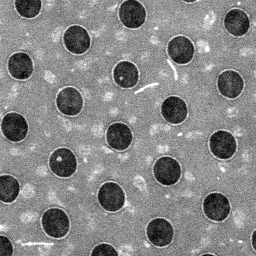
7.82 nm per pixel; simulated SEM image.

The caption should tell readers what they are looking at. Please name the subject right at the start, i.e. a regular array of raised bodies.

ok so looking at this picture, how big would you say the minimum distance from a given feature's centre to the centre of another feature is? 471 nm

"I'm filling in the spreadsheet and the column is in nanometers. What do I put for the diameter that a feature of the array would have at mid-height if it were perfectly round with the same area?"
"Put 230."